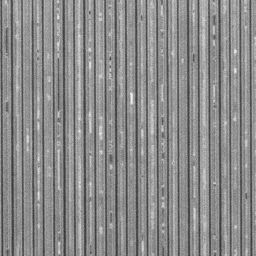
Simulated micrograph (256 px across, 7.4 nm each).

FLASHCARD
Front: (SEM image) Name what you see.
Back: parallel lines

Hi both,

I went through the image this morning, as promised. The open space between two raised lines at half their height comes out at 13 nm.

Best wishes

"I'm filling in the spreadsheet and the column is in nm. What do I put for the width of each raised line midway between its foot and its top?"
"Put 26.8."